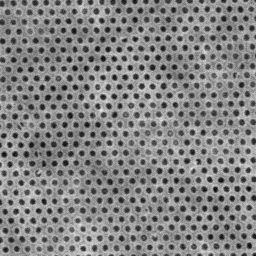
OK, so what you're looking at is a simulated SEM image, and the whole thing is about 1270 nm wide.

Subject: a regular array of holes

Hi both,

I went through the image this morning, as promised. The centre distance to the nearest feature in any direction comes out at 52.4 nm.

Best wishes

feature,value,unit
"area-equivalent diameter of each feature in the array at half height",33.1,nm